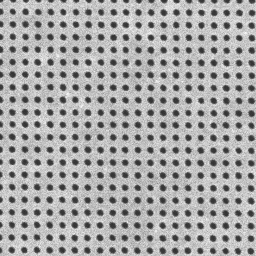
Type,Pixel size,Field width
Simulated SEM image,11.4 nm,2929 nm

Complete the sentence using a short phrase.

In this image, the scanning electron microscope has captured a regular array of holes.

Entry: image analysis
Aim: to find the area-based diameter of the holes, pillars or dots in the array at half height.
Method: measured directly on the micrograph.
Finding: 75.3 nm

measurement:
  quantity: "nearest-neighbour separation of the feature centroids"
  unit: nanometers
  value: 140